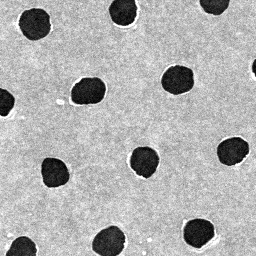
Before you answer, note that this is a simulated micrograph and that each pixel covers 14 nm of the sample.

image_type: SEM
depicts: holes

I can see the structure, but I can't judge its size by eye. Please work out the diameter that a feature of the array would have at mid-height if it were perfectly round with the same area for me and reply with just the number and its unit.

30.5 pixels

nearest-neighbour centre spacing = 1230 nm